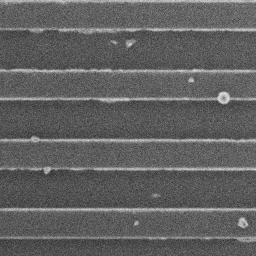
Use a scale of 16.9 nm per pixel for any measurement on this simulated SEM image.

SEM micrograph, lines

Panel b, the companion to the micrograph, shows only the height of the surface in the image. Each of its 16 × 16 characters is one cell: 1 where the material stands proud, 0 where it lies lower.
1111111111111111
1111111111111111
0000000000000000
0000000000000000
1111111111111111
1111111111111111
0000000000000000
0000000000000000
0000000000000000
1111111111111111
1111111111111111
0000000000000000
0000000000000000
1111111111111111
1111111111111111
0000000000000000